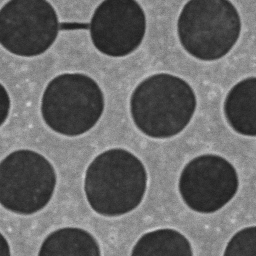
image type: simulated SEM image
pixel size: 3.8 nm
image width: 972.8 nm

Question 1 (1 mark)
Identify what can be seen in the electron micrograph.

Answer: holes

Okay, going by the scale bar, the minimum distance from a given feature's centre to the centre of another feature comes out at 0.341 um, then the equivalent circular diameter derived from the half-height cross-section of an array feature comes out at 242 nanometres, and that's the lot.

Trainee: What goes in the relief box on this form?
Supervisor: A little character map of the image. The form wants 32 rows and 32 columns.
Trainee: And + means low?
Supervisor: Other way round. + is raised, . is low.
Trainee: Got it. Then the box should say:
+.....+++++++....++++++......+++
.......+++++......+++++.......++
.......++++.......++++........++
..................++++........++
.......++++.......++++........++
.......+++++.....++++++......+++
+.....+++++++...+++++++......+++
+++++++++++++++++++++++++..+++++
++++++++++++++++++++++++++++++++
+++++++....++++++++...++++++++++
++++++......+++++.......++++++..
.++++........++++.......+++++...
.++++........+++.........+++....
.++++........+++........++++....
.++++........++++.......++++....
++++++......+++++......++++++...
+++++++....+++++++....++++++++..
++++++++++++++++++++++++++++++++
++++++++++++++++++++++++++++++++
+....+++++++.....++++++++..+++++
......+++++.......+++++......+++
.......++++.......+++++......+++
.......++++.......++++........++
.......++++.......++++........++
......+++++.......+++++......+++
......+++++......++++++.....++++
++..++++++++....+++++++++..+++++
++++++++++++++++++++++++++++++++
++++++++..+++++++++++++++++++++.
++++++......++++++.....++++++...
.++++.......+++++.......++++....
.++++.......++++........++++....